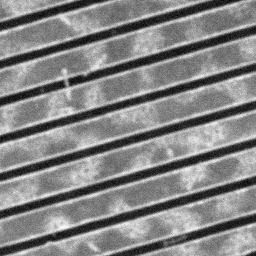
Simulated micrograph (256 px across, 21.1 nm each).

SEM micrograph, parallel lines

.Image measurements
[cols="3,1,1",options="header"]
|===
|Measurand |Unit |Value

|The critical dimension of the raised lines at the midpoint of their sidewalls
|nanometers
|527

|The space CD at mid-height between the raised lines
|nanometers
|238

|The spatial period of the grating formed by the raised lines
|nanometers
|763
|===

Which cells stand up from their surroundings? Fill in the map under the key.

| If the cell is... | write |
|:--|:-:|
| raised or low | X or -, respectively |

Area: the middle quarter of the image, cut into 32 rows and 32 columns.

XXXXXXXXXXX----------XXXXXXXXXXX
XXXXXXX-----------XXXXXXXXXXXXXX
XXXX----------XXXXXXXXXXXXXXXXXX
X----------XXXXXXXXXXXXXXXXXXXXX
-------XXXXXXXXXXXXXXXXXXXXXXX--
----XXXXXXXXXXXXXXXXXXXXXX------
XXXXXXXXXXXXXXXXXXXXXXX---------
XXXXXXXXXXXXXXXXXXX----------XXX
XXXXXXXXXXXXXXXX----------XXXXXX
XXXXXXXXXXXX-----------XXXXXXXXX
XXXXXXXXX---------XXXXXXXXXXXXXX
XXXXX-----------XXXXXXXXXXXXXXXX
X-----------XXXXXXXXXXXXXXXXXXXX
---------XXXXXXXXXXXXXXXXXXXXXX-
-----XXXXXXXXXXXXXXXXXXXXXX-----
--XXXXXXXXXXXXXXXXXXXXXX--------
XXXXXXXXXXXXXXXXXXXX-----------X
XXXXXXXXXXXXXXXXX----------XXXXX
XXXXXXXXXXXXX-----------XXXXXXXX
XXXXXXXXXX----------XXXXXXXXXXXX
XXXXXXX----------XXXXXXXXXXXXXXX
XX------------XXXXXXXXXXXXXXXXXX
----------XXXXXXXXXXXXXXXXXXXXXX
------XXXXXXXXXXXXXXXXXXXXXXX---
---XXXXXXXXXXXXXXXXXXXXXX-------
XXXXXXXXXXXXXXXXXXXXXX----------
XXXXXXXXXXXXXXXXXX-----------XXX
XXXXXXXXXXXXXXX-----------XXXXXX
XXXXXXXXXXX-----------XXXXXXXXXX
XXXXXXXX-----------XXXXXXXXXXXXX
XXXX-----------XXXXXXXXXXXXXXXXX
X-----------XXXXXXXXXXXXXXXXXXXX